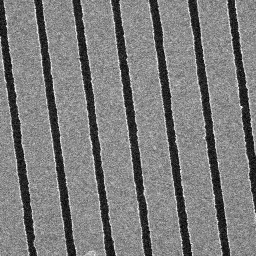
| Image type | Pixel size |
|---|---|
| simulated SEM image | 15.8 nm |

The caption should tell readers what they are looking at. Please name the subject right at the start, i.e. parallel lines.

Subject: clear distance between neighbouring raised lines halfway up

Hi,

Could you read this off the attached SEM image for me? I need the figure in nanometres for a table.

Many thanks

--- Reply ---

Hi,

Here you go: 141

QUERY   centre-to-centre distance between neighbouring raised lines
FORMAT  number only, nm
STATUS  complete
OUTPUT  606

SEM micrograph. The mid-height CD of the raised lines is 469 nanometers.